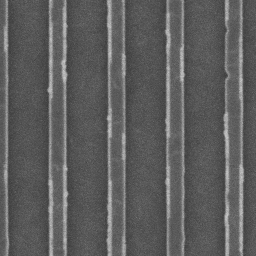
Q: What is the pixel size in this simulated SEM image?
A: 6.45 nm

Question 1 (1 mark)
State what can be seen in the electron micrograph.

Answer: parallel lines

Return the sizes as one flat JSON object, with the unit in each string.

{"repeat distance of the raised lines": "378 nm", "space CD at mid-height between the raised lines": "269 nm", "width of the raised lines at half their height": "16.5 px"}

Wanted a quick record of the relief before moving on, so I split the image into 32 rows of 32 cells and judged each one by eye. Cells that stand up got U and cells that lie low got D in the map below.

UDDDDDUUDDDDDUUUDDDDDUUDDDDDUUDD
UDDDDDUUDDDDDDUUDDDDDUUDDDDDUUDD
UDDDDDUUDDDDDUUUDDDDDUUDDDDDUUDD
UDDDDDUUDDDDDUUUDDDDDUUDDDDDUUDD
UDDDDDUUDDDDDDUUDDDDDUUDDDDDUUDD
UDDDDDUUDDDDDDUUDDDDDUUDDDDDUUDD
UDDDDDUUDDDDDDUUDDDDDUUDDDDDUUDD
UDDDDDUUDDDDDDUUDDDDDUUDDDDDUUDD
UDDDDDUUDDDDDDUUDDDDDUUDDDDDUUDD
UDDDDDUUDDDDDDUUDDDDDUUDDDDDUUDD
UDDDDDUUDDDDDDUUDDDDDUUDDDDDUUDD
UDDDDDUUDDDDDDUUDDDDDUUDDDDDUUDD
UDDDDDUUDDDDDDUUDDDDDUUDDDDDUUDD
UDDDDDUUDDDDDDUUDDDDDUUDDDDDUUDD
UDDDDDUUDDDDDUUUDDDDDUUDDDDDUUDD
UDDDDDUUDDDDDUUUDDDDDUUDDDDDUUDD
UDDDDDUUDDDDDUUUDDDDDUUDDDDDUUDD
UDDDDDUUDDDDDDUUDDDDDUUDDDDDUUDD
UDDDDDUUDDDDDDUUDDDDDUUDDDDDUUDD
UDDDDDUUDDDDDDUUDDDDDUUDDDDDUUDD
UDDDDDUUDDDDDDUUDDDDDUUDDDDDUUDD
UDDDDDUUDDDDDDUUDDDDDUUDDDDDUUDD
UDDDDDUUDDDDDDUUDDDDDUUDDDDDUUDD
UDDDDDUUDDDDDDUUDDDDDUUDDDDDUUDD
UDDDDDUUDDDDDUUUDDDDDUUDDDDDUUDD
UDDDDDUUDDDDDUUUDDDDDUUDDDDDUUDD
UDDDDDUUDDDDDUUUDDDDDUUDDDDDUUDD
UDDDDDUUDDDDDUUUDDDDDUUDDDDDUUDD
UDDDDDUUDDDDDUUUDDDDDUUDDDDDUUDD
UDDDDDUUDDDDDUUUDDDDDUUDDDDDUUDD
UDDDDDUUDDDDDUUUDDDDDUUDDDDDUUDD
UDDDDDUUDDDDDDUUDDDDDUUDDDDDUUDD